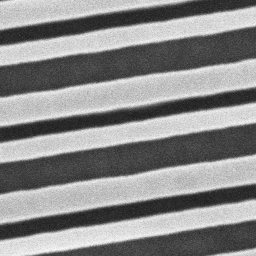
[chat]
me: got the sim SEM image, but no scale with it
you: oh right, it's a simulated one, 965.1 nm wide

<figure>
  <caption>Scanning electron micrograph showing lines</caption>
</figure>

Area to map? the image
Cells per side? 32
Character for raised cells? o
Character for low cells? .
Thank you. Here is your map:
oooooooooooooooooooo............
ooooooooooooo................ooo
ooooooo...............oooooooooo
o..............ooooooooooooooo..
.........ooooooooooooooo........
...oooooooooooooo...............
ooooooooooo.....................
ooooo..........................o
.........................ooooooo
..................oooooooooooooo
............oooooooooooooooooooo
......ooooooooooooooooooooo.....
ooooooooooooooooooooo...........
ooooooooooooooo..............ooo
oooooooo..............oooooooooo
oo..............ooooooooooooooo.
.........ooooooooooooooo........
...ooooooooooooooo..............
oooooooooooo....................
oooooo..........................
.........................ooooooo
...................ooooooooooooo
............oooooooooooooooooooo
......ooooooooooooooooooooo.....
ooooooooooooooooooooo...........
oooooooooooooo...............ooo
oooooooo...............ooooooooo
oo...............oooooooooooooo.
...........oooooooooooooo.......
....ooooooooooooooo.............
ooooooooooooo...................
oooooo........................oo